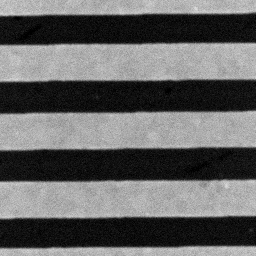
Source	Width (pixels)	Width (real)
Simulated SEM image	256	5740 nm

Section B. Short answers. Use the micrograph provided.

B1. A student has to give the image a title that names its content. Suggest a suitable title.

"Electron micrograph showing lines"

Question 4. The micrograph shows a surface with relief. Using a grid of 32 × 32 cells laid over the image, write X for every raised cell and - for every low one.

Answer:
XXXXXXXXXXXXXXXXXXXXXXXXXXXXXXXX
XXXXXXXXXXXXXXXXXXXXXXXXXXXXXXXX
--------------------------------
--------------------------------
--------------------------------
------------------XXXXXXXXXXXXXX
XXXXXXXXXXXXXXXXXXXXXXXXXXXXXXXX
XXXXXXXXXXXXXXXXXXXXXXXXXXXXXXXX
XXXXXXXXXXXXXXXXXXXXXXXXXXXXXXXX
XXXXXXXXXXXXXXXXXXXXXXXXXXXXXXXX
--------------------------------
--------------------------------
--------------------------------
--------------------------------
XXXXXXXXXXXXXXXXXXXXXXXXXXXXXXXX
XXXXXXXXXXXXXXXXXXXXXXXXXXXXXXXX
XXXXXXXXXXXXXXXXXXXXXXXXXXXXXXXX
XXXXXXXXXXXXXXXXXXXXXXXXXXXXXXXX
XXXXXXXXXXXXXXX-----------------
--------------------------------
--------------------------------
--------------------------------
--------------------------------
XXXXXXXXXXXXXXXXXXXXXXXXXXXXXXXX
XXXXXXXXXXXXXXXXXXXXXXXXXXXXXXXX
XXXXXXXXXXXXXXXXXXXXXXXXXXXXXXXX
XXXXXXXXXXXXXXXXXXXXXXXXXXXXXXXX
--------------------------------
--------------------------------
--------------------------------
--------------------------------
XXXXXXXXXXXXXXXXXXXXXXXXXXXXXXXX